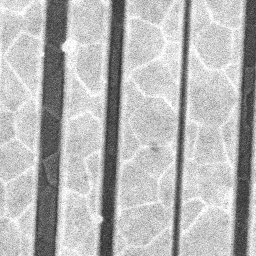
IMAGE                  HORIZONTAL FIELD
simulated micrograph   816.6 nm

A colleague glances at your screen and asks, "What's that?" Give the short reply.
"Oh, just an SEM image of one or a few lines or trenches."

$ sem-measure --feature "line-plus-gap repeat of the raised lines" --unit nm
202